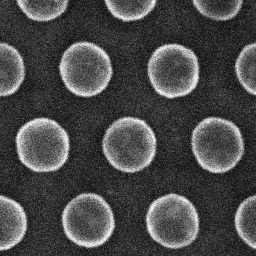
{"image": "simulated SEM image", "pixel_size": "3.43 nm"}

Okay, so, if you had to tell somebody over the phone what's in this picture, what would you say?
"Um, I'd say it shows raised bodies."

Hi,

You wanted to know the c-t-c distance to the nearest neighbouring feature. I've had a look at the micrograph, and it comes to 294 nm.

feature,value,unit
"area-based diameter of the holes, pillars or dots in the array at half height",0.176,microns